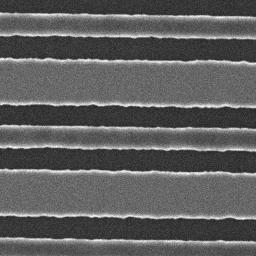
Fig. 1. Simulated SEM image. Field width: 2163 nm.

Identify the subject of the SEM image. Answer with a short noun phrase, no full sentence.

lines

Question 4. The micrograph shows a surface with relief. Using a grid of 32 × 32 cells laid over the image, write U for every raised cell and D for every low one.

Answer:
DDDDDDDDDDDDDDDDDDDDDDDDDDDDDDDD
DDDDDDDDDDDDDDDDDDDDDDDDDDDDDDDD
UUUUUUUUUUUUUUUUUUUUUUUUUUUUUUUU
UUUUUUUUUUUUUUUUUUUUUUUUUUUUUUUU
DDDDDDDDDDUUUUUUUUUUUUUUUUUUUUUU
DDDDDDDDDDDDDDDDDDDDDDDDDDDDDDDD
DDDDDDDDDDDDDDDDDDDDDDDDDDDDDDDD
UUUUUUUDDDUUDDDDDDDDDDDDDDDDDDDD
UUUUUUUUUUUUUUUUUUUUUUUUUUUUUUUU
UUUUUUUUUUUUUUUUUUUUUUUUUUUUUUUU
UUUUUUUUUUUUUUUUUUUUUUUUUUUUUUUU
UUUUUUUUUUUUUUUUUUUUUUUUUUUUUUUU
UUUUUUUUUUUUUUUUUUUUUUUUUUUUUUUU
DDDDDDDDDDDDDDDDDDDDDDDDDDDDDDDD
DDDDDDDDDDDDDDDDDDDDDDDDDDDDDDDD
DDDDDDDDDDDDDDDDDDDDDDDDDDDDDDDD
UUUUUUUUUUUUUUUUUUUUUUUUUUUUUUUU
UUUUUUUUUUUUUUUUUUUUUUUUUUUUUUUU
DUUUDDDDUUUUUUUUUUUUUUUUUUUUUUUU
DDDDDDDDDDDDDDDDDDDDDDDDDDDDDDDD
DDDDDDDDDDDDDDDDDDDDDDDDDDDDDDDD
UUUUUUUUUUUUUUUUUUUUDDDDDDDUDDDD
UUUUUUUUUUUUUUUUUUUUUUUUUUUUUUUU
UUUUUUUUUUUUUUUUUUUUUUUUUUUUUUUU
UUUUUUUUUUUUUUUUUUUUUUUUUUUUUUUU
UUUUUUUUUUUUUUUUUUUUUUUUUUUUUUUU
UUUUUUUUUUUUUUUUUUUUUUUUUUUUUUUU
DDDDDDDDDDDDDDDDDDDDDDDDDDDDDDDD
DDDDDDDDDDDDDDDDDDDDDDDDDDDDDDDD
DDDDDDDDDDDDDDDDDDDDDDDDDDDDDDDD
UUUUUUUUUUUUUUUUUUUUUUUUUUUUUUUU
UUUUUUUUUUUUUUUUUUUUUUUUUUUUUUUU